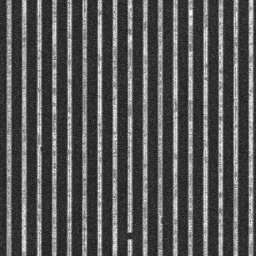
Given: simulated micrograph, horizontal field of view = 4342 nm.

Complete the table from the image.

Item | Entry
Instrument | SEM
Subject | parallel lines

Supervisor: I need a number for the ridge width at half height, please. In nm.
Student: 65.7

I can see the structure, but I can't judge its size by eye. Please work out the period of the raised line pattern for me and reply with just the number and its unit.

256 nm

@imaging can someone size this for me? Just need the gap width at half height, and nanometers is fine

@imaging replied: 197